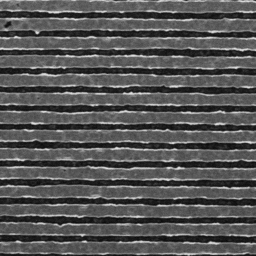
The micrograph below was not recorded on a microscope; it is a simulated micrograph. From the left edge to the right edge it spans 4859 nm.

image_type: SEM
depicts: parallel lines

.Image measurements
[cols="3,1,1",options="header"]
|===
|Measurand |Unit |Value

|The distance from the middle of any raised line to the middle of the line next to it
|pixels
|18.6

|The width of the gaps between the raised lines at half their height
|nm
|123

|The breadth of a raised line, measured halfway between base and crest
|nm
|233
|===